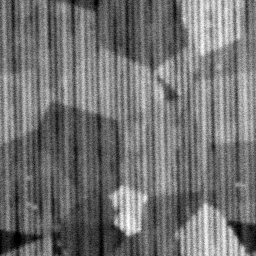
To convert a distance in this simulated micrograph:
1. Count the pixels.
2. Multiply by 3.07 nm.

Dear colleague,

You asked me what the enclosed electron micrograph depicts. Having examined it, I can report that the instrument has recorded parallel lines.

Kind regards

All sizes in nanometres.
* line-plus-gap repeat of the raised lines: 18.4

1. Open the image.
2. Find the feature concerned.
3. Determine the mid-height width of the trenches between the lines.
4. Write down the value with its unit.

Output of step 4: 0.0077 microns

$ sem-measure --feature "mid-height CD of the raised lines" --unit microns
0.01